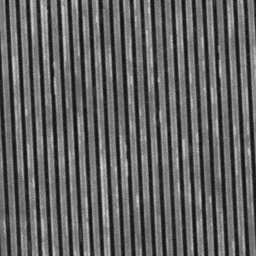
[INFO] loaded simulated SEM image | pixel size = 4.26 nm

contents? parallel lines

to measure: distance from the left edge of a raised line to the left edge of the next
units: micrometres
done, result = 0.0441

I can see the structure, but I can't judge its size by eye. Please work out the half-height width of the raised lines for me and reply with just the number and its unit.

25 nm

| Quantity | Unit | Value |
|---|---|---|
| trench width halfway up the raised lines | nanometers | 21.3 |